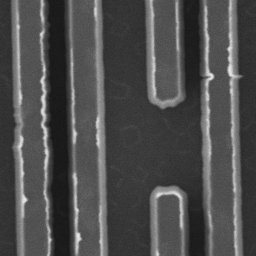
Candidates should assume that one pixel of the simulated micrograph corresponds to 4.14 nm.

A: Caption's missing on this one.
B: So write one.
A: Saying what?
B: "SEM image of one or a few lines or trenches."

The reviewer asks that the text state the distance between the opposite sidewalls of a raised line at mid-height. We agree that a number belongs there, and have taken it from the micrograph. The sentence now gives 129 nanometres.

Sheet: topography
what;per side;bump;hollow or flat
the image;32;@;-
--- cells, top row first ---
--@@@@---@@@-------@@@---@@@@---
--@@@@--@@@@-------@@@---@@@@---
--@@@@--@@@@-------@@@@--@@@@---
--@@@@---@@@-------@@@@--@@@@---
--@@@@---@@@-------@@@@--@@@@---
--@@@@---@@@-------@@@@--@@@@---
--@@@@---@@@-------@@@@--@@@@---
--@@@@---@@@-------@@@@--@@@@---
--@@@@---@@@@------@@@@--@@@@---
--@@@@---@@@@------@@@@---@@@@--
--@@@@---@@@@------@@@@---@@@---
--@@@@---@@@@------@@@@---@@@---
--@@@@---@@@@------@@@---@@@@---
--@@@@---@@@@-------------@@@---
--@@@@---@@@@-------------@@@---
--@@@@---@@@@-------------@@@---
--@@@@---@@@@-------------@@@---
--@@@@---@@@@-------------@@@---
--@@@@---@@@@-------------@@@@--
--@@@@---@@@@-------------@@@@--
--@@@@---@@@@-------------@@@@--
--@@@@---@@@@-------------@@@@--
--@@@@---@@@@-------------@@@@--
--@@@@---@@@@-------------@@@@--
--@@@@---@@@@------@@@@---@@@@--
--@@@@---@@@@------@@@@---@@@@--
--@@@@---@@@@------@@@@---@@@@--
--@@@@---@@@@------@@@@---@@@@--
--@@@@---@@@@------@@@@---@@@@--
--@@@@---@@@@------@@@@---@@@@--
---@@@---@@@@------@@@@---@@@@--
---@@@---@@@@------@@@@---@@@@--